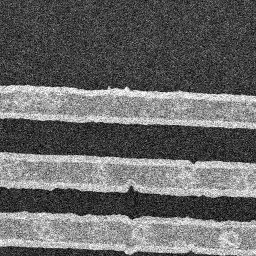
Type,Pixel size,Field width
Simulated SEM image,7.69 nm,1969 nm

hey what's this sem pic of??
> one or a few lines or trenches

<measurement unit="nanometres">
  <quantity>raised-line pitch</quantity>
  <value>488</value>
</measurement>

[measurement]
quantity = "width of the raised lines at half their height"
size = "213 nm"